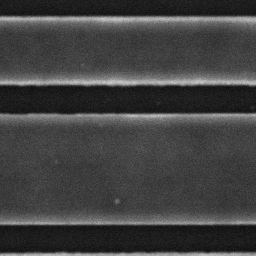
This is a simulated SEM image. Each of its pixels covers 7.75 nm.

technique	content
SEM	lines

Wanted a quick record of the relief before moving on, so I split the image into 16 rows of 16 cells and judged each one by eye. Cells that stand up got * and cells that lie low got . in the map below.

................
****************
****************
****************
****************
................
................
****************
****************
****************
****************
****************
****************
****************
................
................